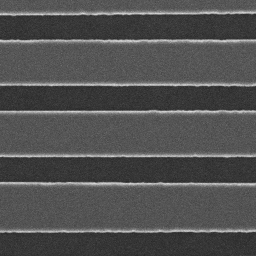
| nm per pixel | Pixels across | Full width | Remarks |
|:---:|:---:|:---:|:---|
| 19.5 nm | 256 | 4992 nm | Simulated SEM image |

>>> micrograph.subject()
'lines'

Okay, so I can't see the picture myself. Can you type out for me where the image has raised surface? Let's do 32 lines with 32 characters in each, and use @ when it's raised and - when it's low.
@@@@@@@@@@@@@@@@@@@@@@@@@@@@@@@@
@@@@@@@@@@@@@@@@@@@@@@@@@@@@@@@@
--------------------------------
--------------------------------
--------------------------------
@@@@@@@@@@@@@@@@@@@@@@@@@@@@@@@@
@@@@@@@@@@@@@@@@@@@@@@@@@@@@@@@@
@@@@@@@@@@@@@@@@@@@@@@@@@@@@@@@@
@@@@@@@@@@@@@@@@@@@@@@@@@@@@@@@@
@@@@@@@@@@@@@@@@@@@@@@@@@@@@@@@@
@@@@@@@@@@@@@@@@@@@@@@@@@@@@@@@@
--------------------------------
--------------------------------
--------------------------------
@@@@@@@@@@@@@@@@@@@@@@@@@@@@@@@@
@@@@@@@@@@@@@@@@@@@@@@@@@@@@@@@@
@@@@@@@@@@@@@@@@@@@@@@@@@@@@@@@@
@@@@@@@@@@@@@@@@@@@@@@@@@@@@@@@@
@@@@@@@@@@@@@@@@@@@@@@@@@@@@@@@@
@@@@@@@@@@@@@@@@@@@@@@@@@@@@@@@@
--------------------------------
--------------------------------
--------------------------------
@@@@@@@@@@@@@@@@@@@@@@@@@@@@@@@@
@@@@@@@@@@@@@@@@@@@@@@@@@@@@@@@@
@@@@@@@@@@@@@@@@@@@@@@@@@@@@@@@@
@@@@@@@@@@@@@@@@@@@@@@@@@@@@@@@@
@@@@@@@@@@@@@@@@@@@@@@@@@@@@@@@@
@@@@@@@@@@@@@@@@@@@@@@@@@@@@@@@@
--------------------------------
--------------------------------
--------------------------------